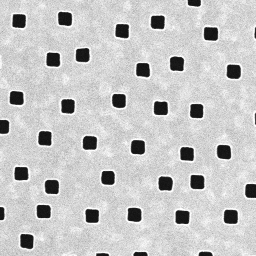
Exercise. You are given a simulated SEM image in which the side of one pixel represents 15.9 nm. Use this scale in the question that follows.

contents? a regular array of holes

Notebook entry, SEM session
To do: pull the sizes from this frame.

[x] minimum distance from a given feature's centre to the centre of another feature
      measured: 0.589 micrometres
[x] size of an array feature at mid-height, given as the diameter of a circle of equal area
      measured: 245 nanometres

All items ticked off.